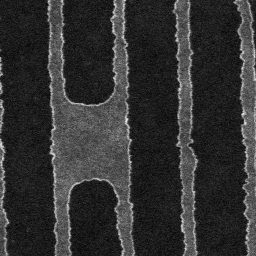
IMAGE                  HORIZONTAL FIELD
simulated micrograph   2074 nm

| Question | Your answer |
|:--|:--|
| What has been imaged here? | parallel lines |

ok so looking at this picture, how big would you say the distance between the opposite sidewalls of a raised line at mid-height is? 102 nanometres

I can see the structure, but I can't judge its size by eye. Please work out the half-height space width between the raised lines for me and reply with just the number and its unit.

410 nm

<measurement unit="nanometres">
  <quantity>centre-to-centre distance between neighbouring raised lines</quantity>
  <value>512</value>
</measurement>